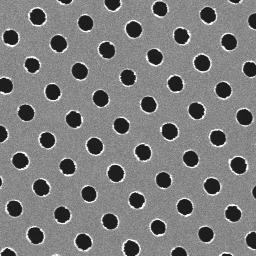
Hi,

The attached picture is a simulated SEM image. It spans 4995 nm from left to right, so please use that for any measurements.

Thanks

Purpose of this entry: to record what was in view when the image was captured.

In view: a regular array of holes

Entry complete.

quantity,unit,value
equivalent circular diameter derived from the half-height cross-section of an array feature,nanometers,312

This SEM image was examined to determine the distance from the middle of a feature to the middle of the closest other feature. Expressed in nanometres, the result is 659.